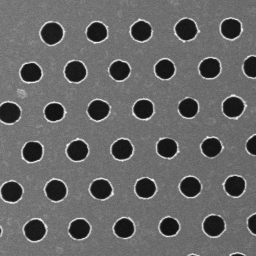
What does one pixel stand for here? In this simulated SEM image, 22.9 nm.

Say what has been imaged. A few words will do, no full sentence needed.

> a regular array of holes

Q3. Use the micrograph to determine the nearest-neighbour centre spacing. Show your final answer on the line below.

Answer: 1020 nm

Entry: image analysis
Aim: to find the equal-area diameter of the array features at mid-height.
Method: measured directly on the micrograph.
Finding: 461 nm